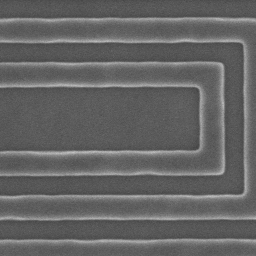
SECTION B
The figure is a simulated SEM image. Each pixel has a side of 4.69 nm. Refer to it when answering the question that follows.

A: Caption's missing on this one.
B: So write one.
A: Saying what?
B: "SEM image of groups of lines, slits or small figures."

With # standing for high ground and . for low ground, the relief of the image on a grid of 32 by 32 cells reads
................................
................................
.#####.#########################
################################
################################
..............................##
...............................#
...............................#
############################...#
############################...#
############################...#
.........................###...#
.........................###...#
.........................###...#
.........................###...#
.........................###...#
.........................###...#
.........................###...#
.........................###...#
############################...#
############################...#
############################...#
...............................#
...............................#
..######################.#######
################################
################################
................................
................................
................................
################################
################################